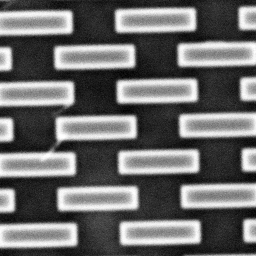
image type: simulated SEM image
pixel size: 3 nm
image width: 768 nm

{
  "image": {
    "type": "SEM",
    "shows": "groups of lines, slits or small figures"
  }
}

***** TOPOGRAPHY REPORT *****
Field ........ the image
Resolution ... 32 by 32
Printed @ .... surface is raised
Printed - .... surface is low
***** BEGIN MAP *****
--------------------------------
---------------@@@@@@@@@------@@
@@@@@@@@@------@@@@@@@@@------@@
@@@@@@@@@------@@@@@@@@@--------
--------------------------------
-----------------------------@@@
@------@@@@@@@@@@-----@@@@@@@@@@
@------@@@@@@@@@@------@@@@@@@@@
@-------------------------------
--------------------------------
---------------@@@@@@@@@------@@
@@@@@@@@@------@@@@@@@@@------@@
@@@@@@@@@------@@@@@@@@@--------
--------------------------------
---------------------------@@@@@
@------@@@@@@@@@@------@@@@@@@@@
@------@@@@@@@@@@------@@@@@@@@@
--------------------------------
--------------------------------
-@@@@@@@@------@@@@@@@@@@------@
@@@@@@@@@------@@@@@@@@@@------@
@@@@@@@@@-----------------------
--------------------------------
-----------------------@@@@@@@@@
@@------@@@@@@@@@------@@@@@@@@@
@@------@@@@@@@@@------@@@@@@@@@
--------------------------------
--------------------------------
@@@@@@@@@------@@@@@@@@@@------@
@@@@@@@@@------@@@@@@@@@@------@
@@@@@@@-------------------------
--------------------------------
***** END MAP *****